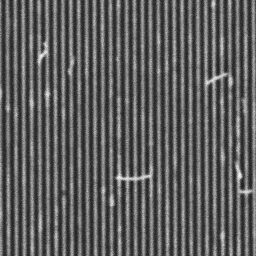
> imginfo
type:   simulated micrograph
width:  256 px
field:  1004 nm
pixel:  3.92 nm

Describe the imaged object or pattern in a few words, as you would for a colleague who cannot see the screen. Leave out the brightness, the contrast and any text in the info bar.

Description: parallel lines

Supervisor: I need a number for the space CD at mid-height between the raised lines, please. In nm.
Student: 19.1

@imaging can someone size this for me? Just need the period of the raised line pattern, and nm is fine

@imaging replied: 31.1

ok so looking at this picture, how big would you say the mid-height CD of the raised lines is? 2.88 px